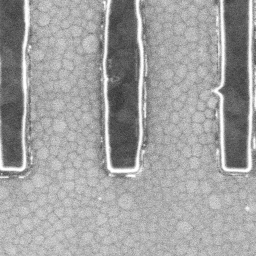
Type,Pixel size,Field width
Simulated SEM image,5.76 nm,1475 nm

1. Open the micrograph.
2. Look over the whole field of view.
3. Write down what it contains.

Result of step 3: one or a few lines or trenches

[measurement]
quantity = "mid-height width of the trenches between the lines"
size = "468 nm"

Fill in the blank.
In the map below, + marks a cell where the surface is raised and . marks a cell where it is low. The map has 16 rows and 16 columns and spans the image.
++.....++.....++
++.....++.....++
++.....++.....++
+......++.....++
++.....++.....++
++.....++.....++
++.....++.....++
++.....++.....++
+......++.....++
+......++.....++
+......+......+.
................
................
................
................
................